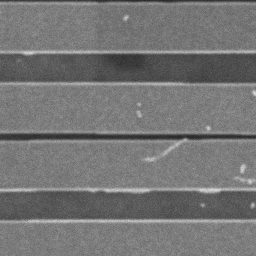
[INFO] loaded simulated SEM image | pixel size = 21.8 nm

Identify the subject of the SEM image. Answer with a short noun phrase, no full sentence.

lines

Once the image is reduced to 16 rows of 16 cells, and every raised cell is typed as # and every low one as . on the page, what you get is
################
################
################
................
................
################
################
################
.###############
################
################
################
................
................
################
################